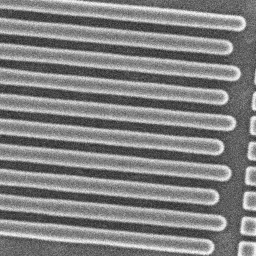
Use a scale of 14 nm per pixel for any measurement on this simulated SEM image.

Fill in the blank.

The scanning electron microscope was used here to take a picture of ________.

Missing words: groups of lines, slits or small figures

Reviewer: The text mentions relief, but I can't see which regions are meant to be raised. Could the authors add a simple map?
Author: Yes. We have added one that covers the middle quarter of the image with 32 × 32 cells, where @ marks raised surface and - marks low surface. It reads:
-----@@@@@@@@@@@@@@@@@@@@@@@@@@@
----------------@@@@@@@@@@@@@@@@
-------------------------@@@@@@@
@@@@@@--------------------------
@@@@@@@@@@@@@@@@@---------------
@@@@@@@@@@@@@@@@@@@@@@@@@@@@----
--@@@@@@@@@@@@@@@@@@@@@@@@@@@@@@
------------@@@@@@@@@@@@@@@@@@@@
---------------------@@@@@@@@@@@
@@@@@@--------------------------
@@@@@@@@@@@@@@@-----------------
@@@@@@@@@@@@@@@@@@@@@@@@@-------
@@@@@@@@@@@@@@@@@@@@@@@@@@@@@@@@
--------@@@@@@@@@@@@@@@@@@@@@@@@
--------------------@@@@@@@@@@@@
@@-----------------------------@
@@@@@@@@@@@@--------------------
@@@@@@@@@@@@@@@@@@@@@@----------
@@@@@@@@@@@@@@@@@@@@@@@@@@@@@@@-
-----@@@@@@@@@@@@@@@@@@@@@@@@@@@
-----------------@@@@@@@@@@@@@@@
----------------------------@@@@
@@@@@@@@------------------------
@@@@@@@@@@@@@@@@@@--------------
@@@@@@@@@@@@@@@@@@@@@@@@@@@@----
---@@@@@@@@@@@@@@@@@@@@@@@@@@@@@
--------------@@@@@@@@@@@@@@@@@@
------------------------@@@@@@@@
@@@@@@--------------------------
@@@@@@@@@@@@@@@@----------------
@@@@@@@@@@@@@@@@@@@@@@@@@-------
@@@@@@@@@@@@@@@@@@@@@@@@@@@@@@@@